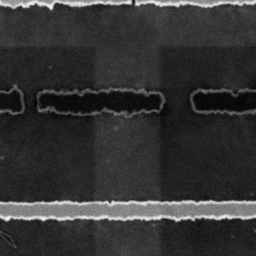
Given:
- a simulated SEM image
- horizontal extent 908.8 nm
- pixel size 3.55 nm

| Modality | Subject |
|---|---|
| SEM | one or a few lines or trenches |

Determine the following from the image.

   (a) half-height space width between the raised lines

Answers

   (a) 312 nm